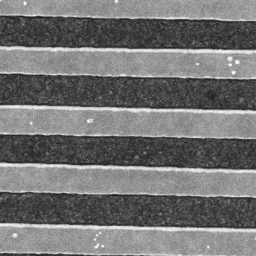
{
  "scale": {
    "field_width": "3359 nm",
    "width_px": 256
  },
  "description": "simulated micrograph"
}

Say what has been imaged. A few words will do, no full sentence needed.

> lines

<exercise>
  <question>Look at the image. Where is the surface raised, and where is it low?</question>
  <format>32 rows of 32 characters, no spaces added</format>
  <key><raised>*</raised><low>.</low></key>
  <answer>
********************************
********************************
...........................*****
................................
................................
................................
********************************
********************************
********************************
................****************
................................
................................
................................
***************.................
********************************
********************************
********************************
................................
................................
................................
*****...........................
********************************
********************************
********************************
.........................**.****
................................
................................
................................
*********************...........
********************************
********************************
********************************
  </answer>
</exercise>